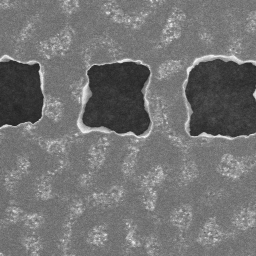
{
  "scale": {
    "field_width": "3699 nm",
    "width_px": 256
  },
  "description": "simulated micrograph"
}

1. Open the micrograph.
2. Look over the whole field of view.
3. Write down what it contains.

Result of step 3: holes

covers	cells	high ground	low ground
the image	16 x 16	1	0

1111111111111111
1111111111111111
1111111111111111
1111111111111111
0011110001110000
0001110001110000
0001100001110000
0011100001110000
1111111111111101
1111111111111111
1111111111111111
1111111111111111
1111111111111111
1111111111111111
1111111111111111
1111111111111111